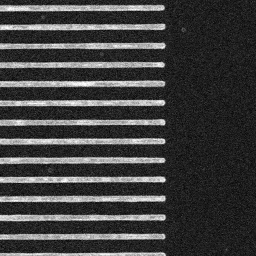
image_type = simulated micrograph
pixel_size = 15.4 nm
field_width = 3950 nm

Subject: parallel lines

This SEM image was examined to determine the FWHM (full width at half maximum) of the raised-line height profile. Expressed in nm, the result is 79.1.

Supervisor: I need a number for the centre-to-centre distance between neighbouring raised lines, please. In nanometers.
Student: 293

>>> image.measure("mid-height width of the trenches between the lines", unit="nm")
212